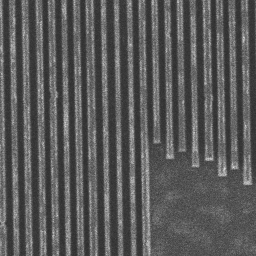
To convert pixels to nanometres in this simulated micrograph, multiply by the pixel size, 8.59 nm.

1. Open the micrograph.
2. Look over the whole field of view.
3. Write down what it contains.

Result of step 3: parallel lines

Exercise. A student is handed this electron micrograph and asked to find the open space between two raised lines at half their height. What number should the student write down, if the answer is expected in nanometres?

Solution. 50.5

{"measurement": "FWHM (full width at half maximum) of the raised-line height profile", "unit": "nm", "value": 58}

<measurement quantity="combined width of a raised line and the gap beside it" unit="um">0.111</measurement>